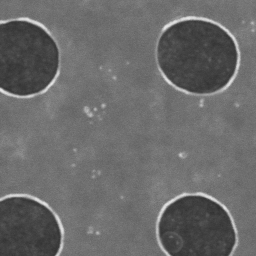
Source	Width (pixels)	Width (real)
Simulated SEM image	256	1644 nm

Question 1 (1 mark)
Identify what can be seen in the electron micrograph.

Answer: holes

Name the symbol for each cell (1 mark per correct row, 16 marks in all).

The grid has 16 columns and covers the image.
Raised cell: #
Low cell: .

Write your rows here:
################
..#########..###
...#######.....#
....######.....#
....######.....#
...########...##
################
################
################
################
################
################
..#########..###
...#######....##
....######.....#
....######.....#